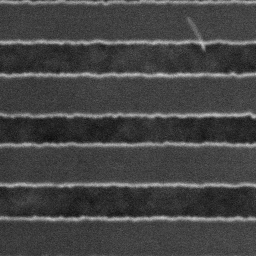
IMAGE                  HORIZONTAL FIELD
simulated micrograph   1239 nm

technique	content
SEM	lines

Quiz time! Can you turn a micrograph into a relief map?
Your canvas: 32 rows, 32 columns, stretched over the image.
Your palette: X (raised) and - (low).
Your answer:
XXXXXXXXXXXXXXXXXXXXXXXXXXXXXXXX
XXXXXXXXXXXXXXXXXXXXXXXXXXXXXXXX
XXXXXXXXXXXXXXXXXXXXXXXXXXXXXXXX
XXXXXXXXXXXXXXXXXXXXXXXXXXXXXXXX
XXXXXXXXXXXXXXXXXXXXXXXXXXXXXXXX
-------------------------X------
--------------------------------
--------------------------------
--------------------------------
XXXXXXXXXXXXXXXXXXXXXXXXXXXXXXXX
XXXXXXXXXXXXXXXXXXXXXXXXXXXXXXXX
XXXXXXXXXXXXXXXXXXXXXXXXXXXXXXXX
XXXXXXXXXXXXXXXXXXXXXXXXXXXXXXXX
XXXXXXXXXXXXXXXXXXXXXXXXXXXXXXXX
XXXXXXXXXXXXXXXXXXXXXXXXXXXXXXXX
--------------------------------
--------------------------------
--------------------------------
XXXXXXXXXXXXXXXXXXXXXXXXXXXXXXXX
XXXXXXXXXXXXXXXXXXXXXXXXXXXXXXXX
XXXXXXXXXXXXXXXXXXXXXXXXXXXXXXXX
XXXXXXXXXXXXXXXXXXXXXXXXXXXXXXXX
XXXXXXXXXXXXXXXXXXXXXXXXXXXXXXXX
--------------------------------
--------------------------------
--------------------------------
--------------------------------
XXXXXXXXXXXXXXXXXXXXXXXXXXXXXXXX
XXXXXXXXXXXXXXXXXXXXXXXXXXXXXXXX
XXXXXXXXXXXXXXXXXXXXXXXXXXXXXXXX
XXXXXXXXXXXXXXXXXXXXXXXXXXXXXXXX
XXXXXXXXXXXXXXXXXXXXXXXXXXXXXXXX